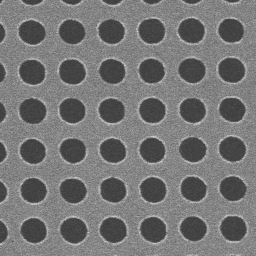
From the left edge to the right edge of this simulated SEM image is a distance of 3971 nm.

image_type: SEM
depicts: a regular array of holes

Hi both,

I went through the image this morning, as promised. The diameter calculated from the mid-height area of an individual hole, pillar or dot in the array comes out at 408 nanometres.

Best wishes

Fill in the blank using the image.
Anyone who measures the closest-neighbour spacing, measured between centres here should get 611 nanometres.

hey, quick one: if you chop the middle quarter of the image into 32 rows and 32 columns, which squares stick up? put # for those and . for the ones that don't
.....####......####......####...
.....####......####......###....
.....####......####......####...
.....####......####......####...
....######....######....######..
################################
################################
################################
#..########.#########..########.
.....####.....#####......####...
.....####......####......####...
......##.......####.......###...
......###......####......####...
.....####......####......####...
....#######..#######....######..
################################
################################
################################
#..##################.########..
.....#####....######.....####...
.....####......####......####...
......###.......###......####...
......###.......###......####...
.....#####.....#####.....#####..
#...#######...#######...#######.
################################
################################
################################
#..########..########..#######..
.....#####.....#####.....####...
.....####......####......####...
......###.......###.......###...